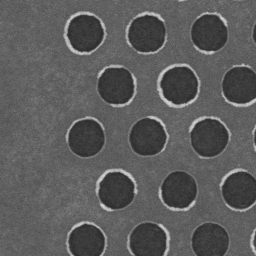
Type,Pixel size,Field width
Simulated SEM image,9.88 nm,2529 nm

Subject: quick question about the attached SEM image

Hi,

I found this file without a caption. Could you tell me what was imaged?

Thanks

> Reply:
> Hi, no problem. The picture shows a regular array of holes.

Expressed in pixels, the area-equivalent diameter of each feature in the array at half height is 37.4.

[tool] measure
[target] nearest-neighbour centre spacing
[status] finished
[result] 596 nm